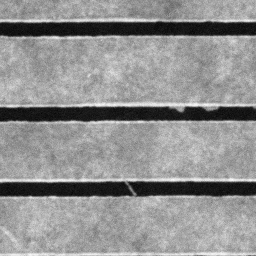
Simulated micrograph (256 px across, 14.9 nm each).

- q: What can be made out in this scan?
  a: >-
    lines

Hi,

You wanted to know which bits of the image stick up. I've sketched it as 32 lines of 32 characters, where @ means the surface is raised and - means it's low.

@@@@@@@@@@@@@@@@@@@@@@@@@@@@@@@@
@@@@@@@@@@@@@@@@@@@@@@@@@@@@@@@@
@@@@@@@@@@@@@@--@@@@@@@@@@@@@@@@
--------------------------------
--------------------------------
@@@@@@@@@@@@@@@@@@@@@@@@@@@@@@@@
@@@@@@@@@@@@@@@@@@@@@@@@@@@@@@@@
@@@@@@@@@@@@@@@@@@@@@@@@@@@@@@@@
@@@@@@@@@@@@@@@@@@@@@@@@@@@@@@@@
@@@@@@@@@@@@@@@@@@@@@@@@@@@@@@@@
@@@@@@@@@@@@@@@@@@@@@@@@@@@@@@@@
@@@@@@@@@@@@@@@@@@@@@@@@@@@@@@@@
@@@@@@@@@@@@@@@@@@@@@@@@@@@@@@@@
--------------------------------
--------------------------------
@@@@@@@@@@@@@@@@@@@@@@@@@@@@@@@@
@@@@@@@@@@@@@@@@@@@@@@@@@@@@@@@@
@@@@@@@@@@@@@@@@@@@@@@@@@@@@@@@@
@@@@@@@@@@@@@@@@@@@@@@@@@@@@@@@@
@@@@@@@@@@@@@@@@@@@@@@@@@@@@@@@@
@@@@@@@@@@@@@@@@@@@@@@@@@@@@@@@@
@@@@@@@@@@@@@@@@@@@@@@@@@@@@@@@@
@@@@@@@@@@@@@@-@-@-----------@--
--------------------------------
--------------------------------
@@@@@@@@@@@@@@@@@@@@@@@@@@@@@@@@
@@@@@@@@@@@@@@@@@@@@@@@@@@@@@@@@
@@@@@@@@@@@@@@@@@@@@@@@@@@@@@@@@
@@@@@@@@@@@@@@@@@@@@@@@@@@@@@@@@
@@@@@@@@@@@@@@@@@@@@@@@@@@@@@@@@
@@@@@@@@@@@@@@@@@@@@@@@@@@@@@@@@
@@@@@@@@@@@@@@@@@@@@@@@@@@@@@@@@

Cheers